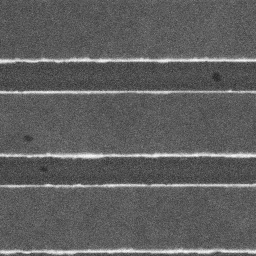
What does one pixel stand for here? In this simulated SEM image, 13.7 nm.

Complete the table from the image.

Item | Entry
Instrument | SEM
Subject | lines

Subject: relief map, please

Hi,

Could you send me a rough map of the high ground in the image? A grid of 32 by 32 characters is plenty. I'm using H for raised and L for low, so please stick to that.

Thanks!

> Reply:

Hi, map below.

HHHHHHHHHHHHHHHHHHHHHHHHHHHHHHHH
HHHHHHHHHHHHHHHHHHHHHHHHHHHHHHHH
HHHHHHHHHHHHHHHHHHHHHHHHHHHHHHHH
HHHHHHHHHHHHHHHHHHHHHHHHHHHHHHHH
HHHHHHHHHHHHHHHHHHHHHHHHHHHHHHHH
HHHHHHHHHHHHHHHHHHHHHHHHHHHHHHHH
HHHHHHHHHHHHHHHHHHHHHHHHHHHHHHHH
HHHHHHHHHHHHHHHHHHHHHHHHHHHHHHHH
LLLLLLLLLLLLLLLLLLLLLLLLLLLLLLLL
LLLLLLLLLLLLLLLLLLLLLLLLLLLLLLLL
LLLLLLLLLLLLLLLLLLLLLLLLLLLLLLLL
HHHHHHHHHHHHHHHHHHHHHHHHHHHHHHHH
HHHHHHHHHHHHHHHHHHHHHHHHHHHHHHHH
HHHHHHHHHHHHHHHHHHHHHHHHHHHHHHHH
HHHHHHHHHHHHHHHHHHHHHHHHHHHHHHHH
HHHHHHHHHHHHHHHHHHHHHHHHHHHHHHHH
HHHHHHHHHHHHHHHHHHHHHHHHHHHHHHHH
HHHHHHHHHHHHHHHHHHHHHHHHHHHHHHHH
HHHHHHHHHHHHHHHHHHHHHHHHHHHHHHHH
LLLLLLLLLLLLLLLLLLLLLLLLLLLLLLLL
LLLLLLLLLLLLLLLLLLLLLLLLLLLLLLLL
LLLLLLLLLLLLLLLLLLLLLLLLLLLLLLLL
LLLLLLLLLLLLLLLLLLLLLLLLLLLLLLLL
HHHHHHHHHHHHHHHHHHHHHHHHHHHHHHHH
HHHHHHHHHHHHHHHHHHHHHHHHHHHHHHHH
HHHHHHHHHHHHHHHHHHHHHHHHHHHHHHHH
HHHHHHHHHHHHHHHHHHHHHHHHHHHHHHHH
HHHHHHHHHHHHHHHHHHHHHHHHHHHHHHHH
HHHHHHHHHHHHHHHHHHHHHHHHHHHHHHHH
HHHHHHHHHHHHHHHHHHHHHHHHHHHHHHHH
HHHHHHHHHHHHHHHHHHHHHHHHHHHHHHHH
LLLHLLLLLLLLLLLLLLLLLLLLLLLLLLLL